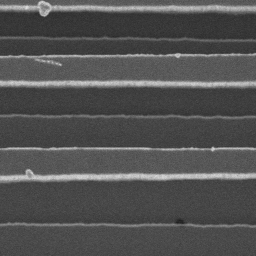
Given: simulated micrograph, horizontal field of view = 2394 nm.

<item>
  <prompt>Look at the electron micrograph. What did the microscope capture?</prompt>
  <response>lines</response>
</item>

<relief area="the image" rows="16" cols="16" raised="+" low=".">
++++++++++++++++
................
................
++++++++++++++++
++++++++++++++++
................
................
................
................
++++++++++++++++
++++++++++++++++
................
................
................
................
................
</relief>